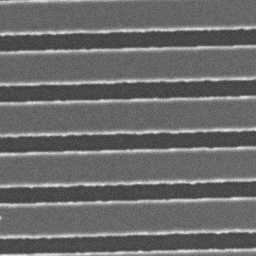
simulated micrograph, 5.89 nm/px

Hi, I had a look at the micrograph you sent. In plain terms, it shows lines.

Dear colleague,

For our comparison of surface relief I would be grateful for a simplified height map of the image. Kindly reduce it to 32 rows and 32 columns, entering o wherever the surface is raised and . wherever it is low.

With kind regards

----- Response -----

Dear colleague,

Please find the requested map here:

oooooooooooooooooooooooooooooooo
oooooooooooooooooooooooooooooooo
oooooooooooooooooooooooooooooooo
oooooooooooooooooooooooooooooooo
................................
................................
.ooooooooooooooooooooooooooooooo
oooooooooooooooooooooooooooooooo
oooooooooooooooooooooooooooooooo
oooooooooooooooooooooooooooooooo
ooooo...........................
................................
................oooooooooooooooo
oooooooooooooooooooooooooooooooo
oooooooooooooooooooooooooooooooo
oooooooooooooooooooooooooooooooo
oooooooooooooooooooo.oo.........
................................
.............................ooo
oooooooooooooooooooooooooooooooo
oooooooooooooooooooooooooooooooo
oooooooooooooooooooooooooooooooo
oooooooooooooooooooooooooooooooo
................................
................................
....oooooooooooooooooooooooooooo
oooooooooooooooooooooooooooooooo
oooooooooooooooooooooooooooooooo
oooooooooooooooooooooooooooooooo
ooooooooooo.....................
................................
.................o.ooooooooooooo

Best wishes